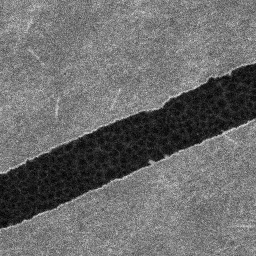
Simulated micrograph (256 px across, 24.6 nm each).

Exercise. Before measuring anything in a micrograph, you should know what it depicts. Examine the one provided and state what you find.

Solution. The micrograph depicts one or a few lines or trenches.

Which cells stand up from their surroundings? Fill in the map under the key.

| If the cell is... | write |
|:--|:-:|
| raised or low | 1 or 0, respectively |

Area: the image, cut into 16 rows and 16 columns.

1111111111111111
1111111111111111
1111111111111111
1111111111111111
1111111111111100
1111111111110000
1111111111000000
1111111000000000
1111100000000011
1110000000011111
1000000001111111
0000000111111111
0000011111111111
0011111111111111
1111111111111111
1111111111111111